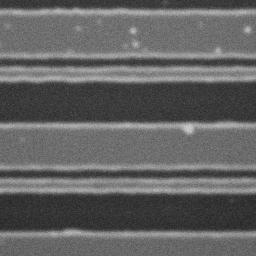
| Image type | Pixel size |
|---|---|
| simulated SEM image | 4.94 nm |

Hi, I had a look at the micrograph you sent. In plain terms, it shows lines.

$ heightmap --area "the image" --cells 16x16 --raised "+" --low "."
................
++++++++++++++++
++++++++++++++++
++++++++++++++++
++++++++++++++++
................
................
................
++++++++++++++++
++++++++++++++++
++++++++++++++++
++++++++++++++++
................
................
....+...........
++++++++++++++++